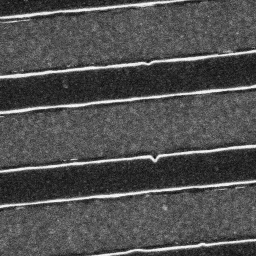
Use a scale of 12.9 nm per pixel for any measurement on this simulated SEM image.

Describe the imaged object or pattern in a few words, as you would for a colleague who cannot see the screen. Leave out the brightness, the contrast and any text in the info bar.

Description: one or a few lines or trenches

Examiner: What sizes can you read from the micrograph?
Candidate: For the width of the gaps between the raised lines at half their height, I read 751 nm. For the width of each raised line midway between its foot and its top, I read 458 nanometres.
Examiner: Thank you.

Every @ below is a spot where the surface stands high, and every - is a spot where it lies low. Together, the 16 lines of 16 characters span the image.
@@@@@@@---------
----------------
----------------
-------------@@@
---@@@@@@@@@@@@@
@@@@@@@@@@@@@@@-
@@@@@@----------
----------------
----------------
------------@@@@
--@@@@@@@@@@@@@@
@@@@@@@@@@@@@@@-
@@@@------------
----------------
----------------
-----------@@@@@